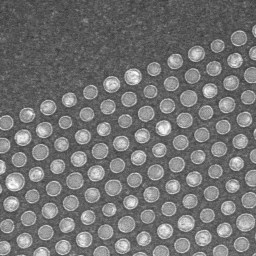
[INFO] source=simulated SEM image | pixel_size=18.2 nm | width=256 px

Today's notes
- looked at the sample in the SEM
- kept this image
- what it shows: a regular array of holes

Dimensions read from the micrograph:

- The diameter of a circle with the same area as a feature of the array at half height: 254 nm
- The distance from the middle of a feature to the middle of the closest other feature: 0.407 µm